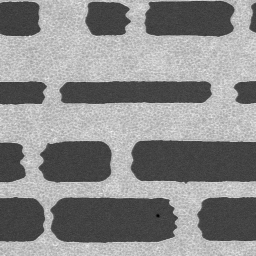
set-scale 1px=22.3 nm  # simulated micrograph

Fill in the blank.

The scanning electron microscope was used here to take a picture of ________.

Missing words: one or a few lines or trenches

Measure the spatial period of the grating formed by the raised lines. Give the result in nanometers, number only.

1460